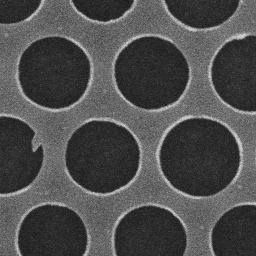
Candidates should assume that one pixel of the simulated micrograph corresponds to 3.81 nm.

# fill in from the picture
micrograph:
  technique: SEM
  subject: holes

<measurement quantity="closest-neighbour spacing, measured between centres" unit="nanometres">370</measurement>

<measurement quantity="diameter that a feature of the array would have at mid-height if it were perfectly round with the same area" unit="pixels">73.8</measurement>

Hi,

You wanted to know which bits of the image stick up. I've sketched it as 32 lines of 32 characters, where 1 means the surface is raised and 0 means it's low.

00000111100000000111100000000011
00001111110000001111100000000111
00011111111100111111110000001111
11111111111111111111111100111111
11111111111111111111111111111110
11110000011111110000001111110000
11100000001111100000000111100000
11000000000111100000000111100000
11000000000111000000000011100000
11000000000111000000000011000000
11100000000111100000000111100000
11100000000111100000000111100000
11110000001111110000001111110000
11111100111111111100111111111000
11111111111111111111111111111111
00011111111000011111110000001111
00001111100000001111100000000111
00001111100000000111000000000011
00000111000000000111000000000011
00000111000000000111000000000011
00000111000000000111000000000011
00000111100000000111000000000011
00001111100000001111100000000111
00011111110000011111110000001111
11111111111111111111111100111111
11111111111111111111111111111111
11110000011111110000011111110000
11100000001111100000001111100000
11000000000111000000000111100000
11000000000111000000000111000000
11000000000111000000000111000000
11000000000111000000000111100000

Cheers